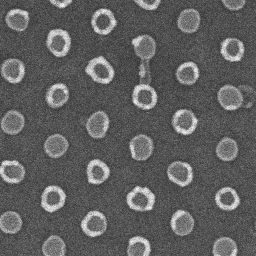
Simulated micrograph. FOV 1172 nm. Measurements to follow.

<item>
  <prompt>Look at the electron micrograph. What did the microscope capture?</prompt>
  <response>a regular array of raised bodies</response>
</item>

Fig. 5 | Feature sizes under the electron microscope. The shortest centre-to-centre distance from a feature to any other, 221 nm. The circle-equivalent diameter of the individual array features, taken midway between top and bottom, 110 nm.